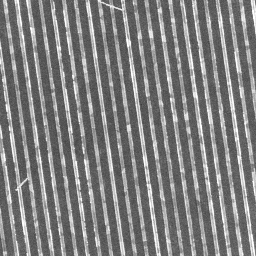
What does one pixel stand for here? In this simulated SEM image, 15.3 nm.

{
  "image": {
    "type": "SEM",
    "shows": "parallel lines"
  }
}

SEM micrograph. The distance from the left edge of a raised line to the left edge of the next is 179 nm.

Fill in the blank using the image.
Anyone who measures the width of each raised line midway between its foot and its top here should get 43.6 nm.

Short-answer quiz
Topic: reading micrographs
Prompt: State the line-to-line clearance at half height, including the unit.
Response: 133 nm